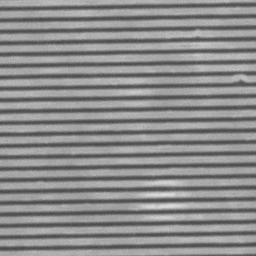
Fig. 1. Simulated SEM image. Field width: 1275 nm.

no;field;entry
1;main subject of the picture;parallel lines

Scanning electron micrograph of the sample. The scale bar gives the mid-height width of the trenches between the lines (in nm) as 24.9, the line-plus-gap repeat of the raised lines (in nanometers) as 56.8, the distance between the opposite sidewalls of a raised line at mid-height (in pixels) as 6.75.